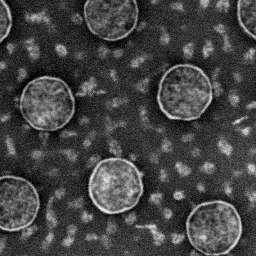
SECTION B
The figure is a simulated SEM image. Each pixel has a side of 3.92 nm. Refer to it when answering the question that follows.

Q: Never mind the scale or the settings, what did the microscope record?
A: raised bodies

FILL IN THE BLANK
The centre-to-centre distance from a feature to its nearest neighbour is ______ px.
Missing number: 107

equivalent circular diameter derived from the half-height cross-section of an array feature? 210 nanometres